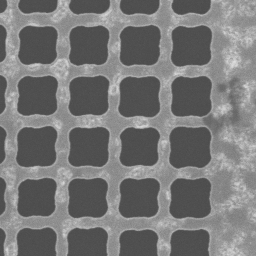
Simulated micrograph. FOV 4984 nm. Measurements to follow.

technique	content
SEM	a regular array of holes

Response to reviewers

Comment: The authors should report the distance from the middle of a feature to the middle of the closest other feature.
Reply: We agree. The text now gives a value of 984 nm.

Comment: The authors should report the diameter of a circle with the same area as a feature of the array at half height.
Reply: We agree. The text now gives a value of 847 nm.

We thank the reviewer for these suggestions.